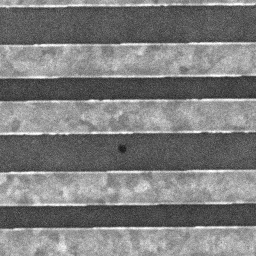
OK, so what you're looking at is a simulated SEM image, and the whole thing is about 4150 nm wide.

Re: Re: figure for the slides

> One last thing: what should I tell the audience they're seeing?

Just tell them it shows lines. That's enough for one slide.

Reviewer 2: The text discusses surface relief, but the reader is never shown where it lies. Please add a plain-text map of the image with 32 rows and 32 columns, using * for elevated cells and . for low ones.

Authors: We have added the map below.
********************************
................................
................................
................................
................................
.......................*********
********************************
********************************
********************************
*********************...........
................................
................................
........................********
********************************
********************************
********************************
*************************.***.*.
................................
................................
................................
................................
.............*******************
********************************
********************************
********************************
********************............
................................
................................
........................********
********************************
********************************
********************************